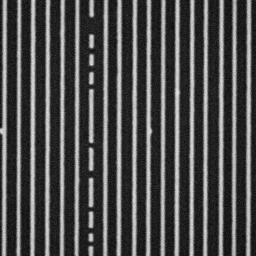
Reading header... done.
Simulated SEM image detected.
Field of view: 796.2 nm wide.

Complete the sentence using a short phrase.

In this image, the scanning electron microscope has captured parallel lines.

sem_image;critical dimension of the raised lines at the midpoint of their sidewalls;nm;9.3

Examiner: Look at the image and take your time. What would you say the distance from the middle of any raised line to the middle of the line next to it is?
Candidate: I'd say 44.7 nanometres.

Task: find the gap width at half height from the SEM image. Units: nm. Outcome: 33.8